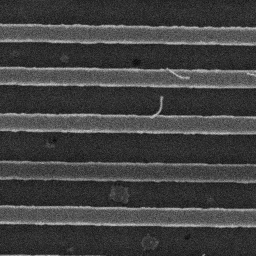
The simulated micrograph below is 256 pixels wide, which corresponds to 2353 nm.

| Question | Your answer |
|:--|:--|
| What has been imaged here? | lines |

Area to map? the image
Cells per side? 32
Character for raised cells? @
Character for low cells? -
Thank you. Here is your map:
--------------------------------
--------------------------------
--------------------------------
@@@@@@@@@@@@@@@@@@@@@@@@@-@-----
@@@@@@@@@@@@@@@@@@@@@@@@@@@@@@@@
-----------------------------@@@
--------------------------------
--------------------------------
@@@@----------------------------
@@@@@@@@@@@@@@@@@@@@@@@@@@@@@@@@
@@@@@@@@@@@@@@@@@@@@@@@@@@@@@@@@
--------------------------------
--------------------------------
--------------------------------
@@@@@@@@@@@@@@@@@--@@-----------
@@@@@@@@@@@@@@@@@@@@@@@@@@@@@@@@
---------@@@@@@@@@@@@@@@@@@@@@@@
--------------------------------
--------------------------------
--------------------------------
@@@@@@@@@@@@@@@@@@@@------------
@@@@@@@@@@@@@@@@@@@@@@@@@@@@@@@@
------------@@-@@@@@@@@@@@@@@@@@
--------------------------------
--------------------------------
--------------------------------
@@@@@@@@@@@@@@@@@@@@@@@@@@@@@@@@
@@@@@@@@@@@@@@@@@@@@@@@@@@@@@@@@
--------------------------------
--------------------------------
--------------------------------
--------------------------------